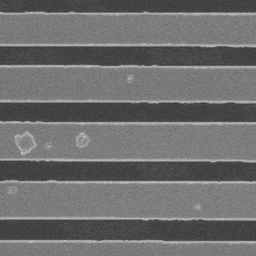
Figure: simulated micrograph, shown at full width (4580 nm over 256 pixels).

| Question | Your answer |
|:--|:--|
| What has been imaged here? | lines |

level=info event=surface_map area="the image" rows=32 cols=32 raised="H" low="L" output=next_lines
LLLLLLLLLLLLLLLLLLLLLLLLLLLLLLLL
LLLLLLLLLLLLLLLLLLLLLLLLLLLLLLLL
HHHHHHHHHHHHHHHHHHHHHHHHHHHHHHHH
HHHHHHHHHHHHHHHHHHHHHHHHHHHHHHHH
HHHHHHHHHHHHHHHHHHHHHHHHHHHHHHHH
HHHHHHHHHHHHHHHHHHHHHHHHHHHHHHHH
LLLLLLLLLLLLLLLLLLLLLLLLLLLLLLLL
LLLLLLLLLLLLLLLLLLLLLLLLLLLLLLLL
HHHHHHHHHHHHHHHHHHHHHHHHHHHHHHHH
HHHHHHHHHHHHHHHHHHHHHHHHHHHHHHHH
HHHHHHHHHHHHHHHHHHHHHHHHHHHHHHHH
HHHHHHHHHHHHHHHHHHHHHHHHHHHHHHHH
HHHHHHHHHHHHHHHHHHHHHHHHHHHHHHHH
LLLLLLLLLLLLLLLLLLLLLLLLLLLLLLLL
LLLLLLLLLLLLLLLLLLLLLLLLLLLLLLLL
HHHHHHHHHHHHHHHHHHHHHHHHHHHHHHHH
HHHHHHHHHHHHHHHHHHHHHHHHHHHHHHHH
HHHHHHHHHHHHHHHHHHHHHHHHHHHHHHHH
HHHHHHHHHHHHHHHHHHHHHHHHHHHHHHHH
HHHHHHHHHHHHHHHHHHHHHHHHHHHHHHHH
LLLLLLLLLLLLLLLLLLLLLLLLLLLLLLLL
LLLLLLLLLLLLLLLLLLLLLLLLLLLLLLLL
LLLLLLLLLLLLLLLLLLLLLLLLLLLLLLLL
HHHHHHHHHHHHHHHHHHHHHHHHHHHHHHHH
HHHHHHHHHHHHHHHHHHHHHHHHHHHHHHHH
HHHHHHHHHHHHHHHHHHHHHHHHHHHHHHHH
HHHHHHHHHHHHHHHHHHHHHHHHHHHHHHHH
LLLLLLLLLLLLLLLLLLLLLLLLLLLLLLLL
LLLLLLLLLLLLLLLLLLLLLLLLLLLLLLLL
LLLLLLLLLLLLLLLLLLLLLLLLLLLLLLLL
HHHHHHHHHHHHHHHHHHHHHHHHHHHHHHHH
HHHHHHHHHHHHHHHHHHHHHHHHHHHHHHHH